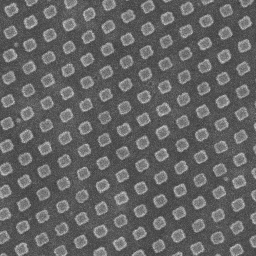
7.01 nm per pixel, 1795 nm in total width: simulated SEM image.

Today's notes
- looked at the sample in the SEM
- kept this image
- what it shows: a regular array of raised bodies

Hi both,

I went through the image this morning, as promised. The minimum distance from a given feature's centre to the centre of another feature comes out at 156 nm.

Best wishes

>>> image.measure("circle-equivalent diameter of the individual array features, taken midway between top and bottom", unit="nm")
81.4